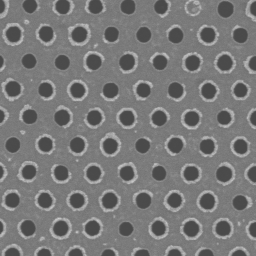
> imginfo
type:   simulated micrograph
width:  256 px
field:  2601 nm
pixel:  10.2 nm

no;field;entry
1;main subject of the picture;a regular array of holes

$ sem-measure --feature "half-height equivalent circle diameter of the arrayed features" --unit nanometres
154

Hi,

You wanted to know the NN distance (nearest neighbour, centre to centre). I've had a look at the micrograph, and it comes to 320 nm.